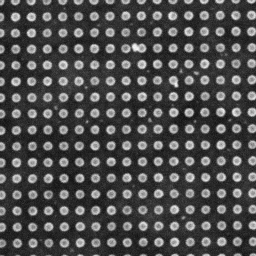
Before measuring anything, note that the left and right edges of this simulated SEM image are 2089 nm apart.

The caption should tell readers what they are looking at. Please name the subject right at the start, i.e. a regular array of raised bodies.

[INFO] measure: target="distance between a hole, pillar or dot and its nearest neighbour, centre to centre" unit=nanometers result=127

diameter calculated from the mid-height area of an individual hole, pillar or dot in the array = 64.5 nanometers